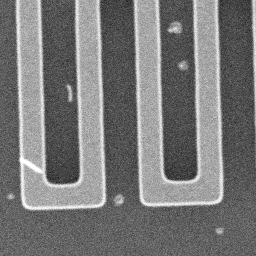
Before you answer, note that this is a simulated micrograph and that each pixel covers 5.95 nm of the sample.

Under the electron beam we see groups of lines, slits or small figures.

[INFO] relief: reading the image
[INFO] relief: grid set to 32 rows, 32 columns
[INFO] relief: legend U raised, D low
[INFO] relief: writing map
DDUUUDDDDDUUDDDDDUUUDDDDUUUDDDDD
DDUUUDDDDDUUDDDDDUUUDDDDUUUDDDDD
DDUUUDDDDDUUDDDDDUUUDDDDUUUDDDDD
DDUUUDDDDDUUDDDDDUUUDDDDUUUDDDDD
DDUUUDDDDDUUDDDDDUUUDDDDUUUDDDDD
DDUUUDDDDDUUDDDDDUUUDDDDUUUDDDDD
DDUUUDDDDDUUDDDDDUUUDDDDUUUDDDDD
DDUUUDDDDDUUDDDDDUUUDDDDUUUDDDDD
DDUUUDDDDDUUUDDDDUUUDDDDDUUDDDDD
DDUUUDDDDDUUUDDDDUUUDDDDDUUDDDDD
DDUUUDDDDDUUUDDDDUUUDDDDDUUDDDDD
DDUUUDDDDDUUUDDDDUUUDDDDDUUDDDDD
DDUUUDDDDDUUUDDDDUUUDDDDDUUDDDDD
DDDUUDDDDDUUUDDDDUUUDDDDDUUDDDDD
DDDUUDDDDDUUUDDDDUUUDDDDDUUUDDDD
DDDUUDDDDDUUUDDDDUUUDDDDDUUUDDDD
DDDUUDDDDDUUUDDDDUUUDDDDDUUUDDDD
DDDUUDDDDDUUUDDDDUUUDDDDDUUUDDDD
DDDUUDDDDDUUUDDDDUUUDDDDDUUUDDDD
DDDUUDDDDDUUUDDDDUUUDDDDDUUUDDDD
DDDUUUDDDDUUUDDDDUUUDDDDDUUUDDDD
DDDUUUDDDDUUUDDDDDUUDDDDDUUUDDDD
DDDUUUDDDDUUUDDDDDUUUDDDUUUUDDDD
DDDUUUUUUUUUUDDDDDUUUUUUUUUUDDDD
DDDUUUUUUUUUUDDDDDUUUUUUUUUUDDDD
DDDUUUUUUUUUUDDDDDUUUUUUDDDDDDDD
DDDDDDDDDDDDDDDDDDDDDDDDDDDDDDDD
DDDDDDDDDDDDDDDDDDDDDDDDDDDDDDDD
DDDDDDDDDDDDDDDDDDDDDDDDDDDDDDDD
DDDDDDDDDDDDDDDDDDDDDDDDDDDDDDDD
DDDDDDDDDDDDDDDDDDDDDDDDDDDDDDDD
DDDDDDDDDDDDDDDDDDDDDDDDDDDDDDDD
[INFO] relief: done